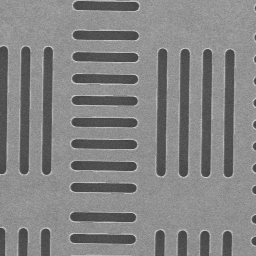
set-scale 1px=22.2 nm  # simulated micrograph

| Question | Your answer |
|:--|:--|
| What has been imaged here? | groups of lines, slits or small figures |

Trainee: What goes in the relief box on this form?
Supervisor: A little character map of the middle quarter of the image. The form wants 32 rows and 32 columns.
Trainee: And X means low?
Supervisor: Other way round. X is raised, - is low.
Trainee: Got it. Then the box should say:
XXXXXXXXXXXXXXXXXXXXXXX---XXX--X
XXXXXXXXXXXXXXXXXXXXXXX---XXX--X
XXX---------XXXXXXXXXXX---XXX--X
XX----------------XXXXX---XXX--X
XX----------------XXXXX---XXX--X
XXXXXXXXXXXXXXXXXXXXXXX---XXX--X
XXXXXXXXXXXXXXXXXXXXXXX---XXX--X
XXXXXXXXXXXXXXXXXXXXXXX---XXX--X
XX----------------XXXXX---XXX--X
XX----------------XXXXX---XXX--X
XXXXXXXXXX-------XXXXXX---XXX--X
XXXXXXXXXXXXXXXXXXXXXXX---XXX--X
XXXXXXXXXXXXXXXXXXXXXXX---XXX--X
XX---------------XXXXXX---XXX--X
XX----------------XXXXX---XXX--X
XX----------------XXXXX---XXX--X
XXXXXXXXXXXXXXXXXXXXXXX---XXX--X
XXXXXXXXXXXXXXXXXXXXXXX---XXX--X
XXXXXXXXXXXXXXXXXXXXXXX---XXX--X
XX----------------XXXXX---XXX--X
XX----------------XXXXX---XXX--X
XXXXXXXXXXXXXXXXXXXXXXX---XXX--X
XXXXXXXXXXXXXXXXXXXXXXX---XXX--X
XXXXXXXXXXXXXXXXXXXXXXX---XXX--X
XX---------------XXXXXX---XXX--X
XX----------------XXXXX---XXX--X
XX----------------XXXXX---XXX--X
XXXXXXXXXXXXXXXXXXXXXXX--XXXX--X
XXXXXXXXXXXXXXXXXXXXXXXXXXXXXXXX
XXXXXXXXXXXXXXXXXXXXXXXXXXXXXXXX
XX----------------XXXXXXXXXXXXXX
XX----------------XXXXXXXXXXXXXX